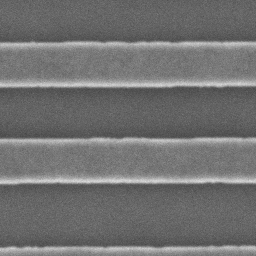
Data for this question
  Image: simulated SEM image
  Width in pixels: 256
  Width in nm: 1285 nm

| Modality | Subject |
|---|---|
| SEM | lines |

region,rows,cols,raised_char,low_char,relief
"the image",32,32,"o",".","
................................
................................
................................
................................
................................
oooooooooooooooooooooooooooooooo
oooooooooooooooooooooooooooooooo
oooooooooooooooooooooooooooooooo
oooooooooooooooooooooooooooooooo
oooooooooooooooooooooooooooooooo
oooooooooooooooooooooooooooooooo
................................
................................
................................
................................
................................
................................
oooooooooooooooooooooooooooooooo
oooooooooooooooooooooooooooooooo
oooooooooooooooooooooooooooooooo
oooooooooooooooooooooooooooooooo
oooooooooooooooooooooooooooooooo
oooooooooooooooooooooooooooooooo
................................
................................
................................
................................
................................
................................
................................
................................
oooooooooooooooooooooooooooooooo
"